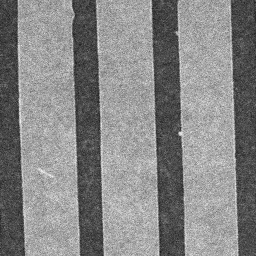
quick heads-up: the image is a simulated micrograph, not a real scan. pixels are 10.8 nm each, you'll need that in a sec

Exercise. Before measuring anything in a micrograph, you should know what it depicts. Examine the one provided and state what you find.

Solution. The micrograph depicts one or a few lines or trenches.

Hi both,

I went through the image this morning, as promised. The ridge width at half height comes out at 0.582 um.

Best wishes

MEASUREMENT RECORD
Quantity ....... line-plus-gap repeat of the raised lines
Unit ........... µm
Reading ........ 0.863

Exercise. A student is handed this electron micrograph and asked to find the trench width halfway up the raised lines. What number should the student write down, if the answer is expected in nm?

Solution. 283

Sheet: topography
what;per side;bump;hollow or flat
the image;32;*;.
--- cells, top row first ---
..*******...*******...*******...
..*******...*******...*******...
..*******...*******...*******...
..*******...*******...*******...
..*******...*******...*******...
..*******...*******...*******...
..*******...*******....******...
..*******...*******....******...
..*******...*******....******...
..*******...*******....******...
..*******...*******....******...
..*******....******....******...
..*******....******....******...
..*******....******....******...
...******....******....******...
...******....******....******...
...******....******....******...
...******....******....******...
...******....******....******...
...******....******....******...
...******....*******...******...
...******....*******...******...
...*******...*******...******...
...*******...*******...******...
...*******...*******...******...
...*******...*******...******...
...*******...*******...******...
...*******...*******...*******..
...*******...*******...*******..
...*******...*******...*******..
...*******...*******...*******..
...*******...*******...*******..